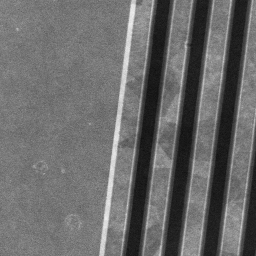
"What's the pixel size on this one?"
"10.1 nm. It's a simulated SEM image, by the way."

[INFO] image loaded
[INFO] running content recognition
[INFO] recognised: parallel lines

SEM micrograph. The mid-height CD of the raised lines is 0.209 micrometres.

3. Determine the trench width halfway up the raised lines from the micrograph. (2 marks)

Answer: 180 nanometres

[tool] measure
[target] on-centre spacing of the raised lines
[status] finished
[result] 391 nanometers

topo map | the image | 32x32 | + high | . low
.................++...++..+++..+
.................++..+++..+++..+
................+++..+++..+++..+
................+++..+++..+++..+
................+++..+++..++...+
................+++..++...++...+
................+++..++...++..++
................++...++...++..++
................++...++..+++..++
................++..+++..+++..++
...............+++..+++..+++..++
...............+++..+++..+++..++
...............+++..+++..++...++
...............+++..+++..++...++
...............+++..++...++..+++
...............++...++...++..+++
...............++...++..+++..+++
...............++..+++..+++..+++
..............+++..+++..+++..+++
..............+++..+++..+++..+++
..............+++..+++..++...++.
..............+++..+++..++...++.
..............+++..++...++..+++.
..............++...++...++..+++.
..............++...++..+++..+++.
..............++..+++..+++..+++.
.............+++..+++..+++..+++.
.............+++..+++..+++..+++.
.............+++..+++..++...++..
.............+++..+++..++...++..
.............+++..++...++...++..
.............++...++...++..+++..